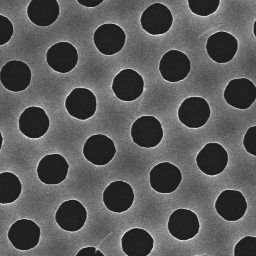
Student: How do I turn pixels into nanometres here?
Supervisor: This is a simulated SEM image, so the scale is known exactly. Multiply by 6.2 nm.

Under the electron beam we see a regular array of holes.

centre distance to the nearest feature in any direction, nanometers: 310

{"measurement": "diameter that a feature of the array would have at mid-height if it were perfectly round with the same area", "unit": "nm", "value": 195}